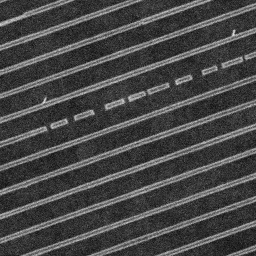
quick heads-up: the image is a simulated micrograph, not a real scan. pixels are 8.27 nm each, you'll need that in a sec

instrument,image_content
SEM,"parallel lines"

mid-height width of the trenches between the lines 159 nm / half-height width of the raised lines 32.1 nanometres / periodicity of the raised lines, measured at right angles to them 188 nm